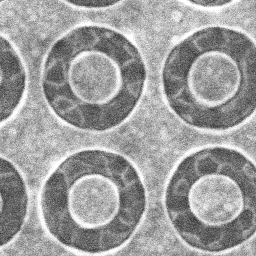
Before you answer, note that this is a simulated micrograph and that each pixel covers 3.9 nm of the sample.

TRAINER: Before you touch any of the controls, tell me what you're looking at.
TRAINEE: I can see ring-shaped grooves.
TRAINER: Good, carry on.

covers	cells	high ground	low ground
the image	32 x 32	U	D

UUUUUUUUUDDDDDDUUUUUUUUUDDDDDUUU
UUUUUUUUUUUUUUUUUUUUUUUUUUUUUUUU
UUUUUUUUUUUUUUUUUUUUUUUUUUUUUUUU
UUUUUUUUUDDDDDUUUUUUUUUUUUDDUUUU
UUUUUUUUDDDDDDDDUUUUUUUDDDDDDDDU
DUUUUUUDDDDDDDDDDUUUUUDDDDDDDDDD
DDUUUUDDDDDDDDDDDUUUUDDDDDDDDDDD
DDDUUUDDDUUUUUDDDDUUUDDDDUUUUDDD
DDDUUDDDDUUUUUUDDDUUDDDDUUUUUUDD
DDDUUDDDDUUUUUUDDDUUDDDDUUUUUUDD
DDDUUDDDDUUUUUUDDDUUDDDDUUUUUUDD
DDDUUDDDDUUUUUDDDDUUDDDDUUUUUDDD
DDDUUUDDDDUUUDDDDUUUUDDDDUUUDDDD
DDUUUUDDDDDDDDDDDUUUUDDDDDDDDDDD
DUUUUUUDDDDDDDDDUUUUUUDDDDDDDDDU
UUUUUUUUDDDDDDDUUUUUUUUDDDDDDDUU
UUUUUUUUUUUUUUUUUUUUUUUUUUUUUUUU
UUUUUUUUUUUUUUUUUUUUUUUUUUUUUUUU
UUUUUUUUUUUUUUUUUUUUUUUUUDDDDUUU
UUUUUUUUUDDDDDDUUUUUUUUDDDDDDDDU
DDUUUUUDDDDDDDDDUUUUUUDDDDDDDDDD
DDUUUUUDDDDDDDDDDUUUUUDDDDDDDDDD
DDDUUUDDDDUUUUDDDDUUUDDDDUUUUDDD
DDDUUDDDDUUUUUUDDDUUUDDDUUUUUUDD
DDDDUDDDDUUUUUUDDDUUUDDDUUUUUUDD
DDDUUDDDDUUUUUUDDDUUUDDDUUUUUUDD
DDDUUDDDDUUUUUUDDDUUUDDDUUUUUUDD
DDDUUDDDDDUUUUDDDDUUUDDDDUUUUDDD
DDDUUUDDDDDDDDDDDUUUUUDDDDDDDDDD
DDUUUUUDDDDDDDDDUUUUUUDDDDDDDDDD
DUUUUUUUDDDDDDDUUUUUUUUDDDDDDDUU
UUUUUUUUUUDDDUUUUUUUUUUUUUDDUUUU